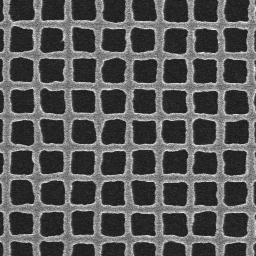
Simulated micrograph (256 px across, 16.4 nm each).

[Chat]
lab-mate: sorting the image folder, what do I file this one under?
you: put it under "a regular array of holes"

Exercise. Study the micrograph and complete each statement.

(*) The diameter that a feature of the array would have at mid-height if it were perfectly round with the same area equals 433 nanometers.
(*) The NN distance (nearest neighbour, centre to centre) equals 29.8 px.